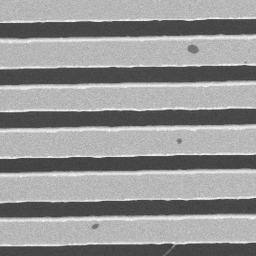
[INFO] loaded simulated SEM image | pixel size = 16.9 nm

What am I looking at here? lines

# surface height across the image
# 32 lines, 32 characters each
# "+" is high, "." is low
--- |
++++++++++++++++++++++++++++++++
++++++++++++++++++++++++++++++++
+++++++++++++++++++++..++.......
................................
........................++++++++
++++++++++++++++++++++++++++++++
++++++++++++++++++++++++++++++++
++++++++++++++++++++++++++++++++
+++.............................
................................
...........+++++++++++++++++++++
++++++++++++++++++++++++++++++++
++++++++++++++++++++++++++++++++
+++++++++++++++++++++++++++++...
................................
................................
++++++++++++++++++++++++++++++++
++++++++++++++++++++++++++++++++
++++++++++++++++++++++++++++++++
++++++++++++++++++..............
................................
..........++++++++++++++++++++++
++++++++++++++++++++++++++++++++
++++++++++++++++++++++++++++++++
++++++++++++++++++++++++++++++++
................................
................................
++++++++++++++++++++++++++++++++
++++++++++++++++++++++++++++++++
++++++++++++++++++++++++++++++++
+++++++++++.....................
................................